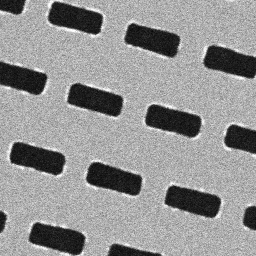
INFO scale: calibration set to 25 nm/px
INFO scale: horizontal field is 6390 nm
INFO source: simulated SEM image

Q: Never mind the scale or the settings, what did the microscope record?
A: holes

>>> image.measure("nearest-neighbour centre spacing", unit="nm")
2010